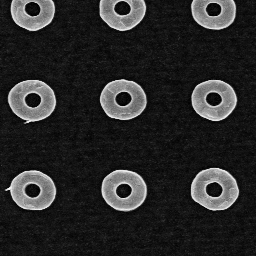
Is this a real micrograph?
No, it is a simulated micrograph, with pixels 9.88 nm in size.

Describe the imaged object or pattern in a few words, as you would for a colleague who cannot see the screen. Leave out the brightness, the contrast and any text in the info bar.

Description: ring-shaped raised bodies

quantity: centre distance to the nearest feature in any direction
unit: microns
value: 0.888